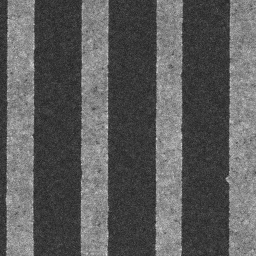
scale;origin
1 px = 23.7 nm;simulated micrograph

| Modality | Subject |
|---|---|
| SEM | one or a few lines or trenches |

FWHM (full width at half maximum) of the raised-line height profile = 592 nm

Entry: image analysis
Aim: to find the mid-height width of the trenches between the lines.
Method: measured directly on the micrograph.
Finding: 1150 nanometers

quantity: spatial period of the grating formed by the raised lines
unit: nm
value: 1750